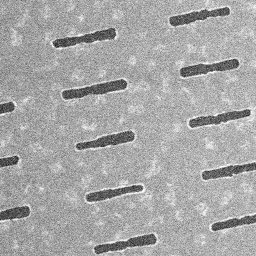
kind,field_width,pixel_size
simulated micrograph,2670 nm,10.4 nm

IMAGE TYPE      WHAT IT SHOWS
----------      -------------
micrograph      a regular array of holes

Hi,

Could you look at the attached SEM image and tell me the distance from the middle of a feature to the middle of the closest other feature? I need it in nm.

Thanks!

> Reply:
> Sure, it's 544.